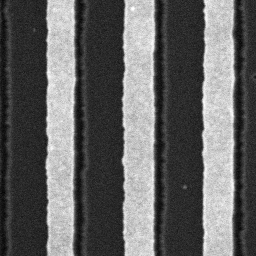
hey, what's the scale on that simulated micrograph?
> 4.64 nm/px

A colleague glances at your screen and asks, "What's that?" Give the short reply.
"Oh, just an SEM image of lines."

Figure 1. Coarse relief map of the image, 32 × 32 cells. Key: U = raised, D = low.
DDDDDDUUUDDDDDDDUUUDDDDDDDUUUDDD
DDDDDDUUUDDDDDDDUUUDDDDDDDUUUDDD
DDDDDDUUUDDDDDDDUUUDDDDDDDUUUDDD
DDDDDDUUUDDDDDDDUUUDDDDDDDUUUDDD
DDDDDDUUUDDDDDDUUUUDDDDDDDUUUDDD
DDDDDDUUUDDDDDDUUUUDDDDDDDUUUDDD
DDDDDDUUUDDDDDDDUUUDDDDDDDUUUDDD
DDDDDDUUUDDDDDDDUUUDDDDDDDUUUDDD
DDDDDDUUUDDDDDDDUUUDDDDDDUUUUDDD
DDDDDDUUUDDDDDDDUUUDDDDDDDUUUDDD
DDDDDDUUUDDDDDDUUUUDDDDDDUUUUDDD
DDDDDDUUUDDDDDDDUUUDDDDDDUUUUDDD
DDDDDDUUUDDDDDDUUUUDDDDDDUUUUDDD
DDDDDDUUUDDDDDDUUUUDDDDDDUUUUDDD
DDDDDDUUUDDDDDDUUUUDDDDDDUUUUDDD
DDDDDDUUUDDDDDDUUUUDDDDDDDUUUDDD
DDDDDDUUUDDDDDDDUUUDDDDDDUUUUDDD
DDDDDDUUUDDDDDDDUUUDDDDDDUUUUDDD
DDDDDDUUUDDDDDDDUUUDDDDDDUUUUDDD
DDDDDDUUUDDDDDDUUUUDDDDDDUUUUDDD
DDDDDDUUUDDDDDDUUUUDDDDDDDUUUDDD
DDDDDDUUUDDDDDDDUUUDDDDDDDUUUDDD
DDDDDDUUUDDDDDDDUUUDDDDDDDUUUDDD
DDDDDDUUUDDDDDDDUUUDDDDDDUUUUDDD
DDDDDDUUUDDDDDDDUUUDDDDDDUUUUDDD
DDDDDDUUUDDDDDDDUUUDDDDDDUUUUDDD
DDDDDDUUUDDDDDDUUUUDDDDDDUUUUDDD
DDDDDDUUUDDDDDDUUUUDDDDDDUUUUDDD
DDDDDDUUUDDDDDDUUUUDDDDDDUUUUDDD
DDDDDDUUUDDDDDDUUUUDDDDDDDUUUDDD
DDDDDDUUUDDDDDDDUUUDDDDDDUUUUDDD
DDDDDDUUUDDDDDDDUUUDDDDDDUUUUDDD